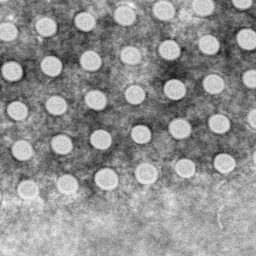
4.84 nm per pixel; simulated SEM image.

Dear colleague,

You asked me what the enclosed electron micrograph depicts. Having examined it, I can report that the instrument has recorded a regular array of raised bodies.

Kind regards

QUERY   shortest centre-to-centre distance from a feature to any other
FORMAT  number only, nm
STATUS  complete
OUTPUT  190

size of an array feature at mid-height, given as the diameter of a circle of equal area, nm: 94.2